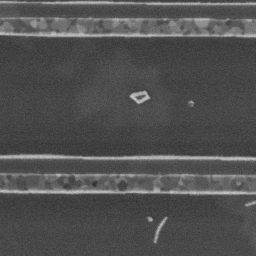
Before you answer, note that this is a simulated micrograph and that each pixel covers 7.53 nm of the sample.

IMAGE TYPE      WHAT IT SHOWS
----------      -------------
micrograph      lines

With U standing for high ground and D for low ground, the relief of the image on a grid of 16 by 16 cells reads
UUUUUUUUUUUUUUUU
UUUUUUUUUUUUUUUU
DDDDDDDDDDDDDDDD
DDDDDDDDDDDDDDDD
DDDDDDDDDDDDDDDD
DDDDDDDDDDDDDDDD
DDDDDDDDDDDDDDDD
DDDDDDDDDDDDDDDD
DDDDDDDDDDDDDDDD
DDDDDDDDDDDDDDDD
UUUUUUUUUUUUUUUU
UUUUUUUUUUUUUUUU
DDDDDDDDDDDDDDDD
DDDDDDDDDDDDDDDD
DDDDDDDDDDDDDDDD
DDDDDDDDDDDDDDDD